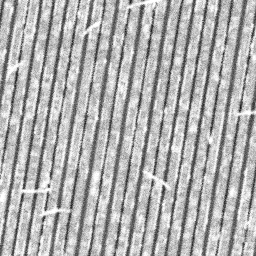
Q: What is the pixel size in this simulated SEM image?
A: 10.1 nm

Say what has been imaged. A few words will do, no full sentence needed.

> parallel lines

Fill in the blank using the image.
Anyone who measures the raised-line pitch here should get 127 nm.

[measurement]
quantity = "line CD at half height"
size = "85 nanometres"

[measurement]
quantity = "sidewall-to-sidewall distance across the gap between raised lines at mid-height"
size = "0.0431 µm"